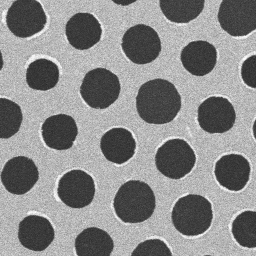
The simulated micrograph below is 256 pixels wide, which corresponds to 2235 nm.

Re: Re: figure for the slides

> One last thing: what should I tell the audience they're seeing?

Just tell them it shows a regular array of holes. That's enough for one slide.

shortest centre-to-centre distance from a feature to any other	517	nm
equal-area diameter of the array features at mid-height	334	nanometres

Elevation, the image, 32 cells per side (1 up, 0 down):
11000111111111101111000000110000
10000011111111111111000001100000
10000011100011111111100011100000
10000111000001110001111111110000
11001111000001100000111111111011
11111111100011100000111100111111
11111111111111100000111000011111
11110011111111110001111000011110
11100001111111111111111000011100
11100001111000011111111111111100
11100001110000011100001111111110
11111111110000011000001111111111
01111111110000011000000111001111
00011111111101111000000110000111
00011100011111111000001110000111
00011000001111111110111110000111
00111000001110001111111111001111
11111000011110000111100111111111
11111100011110000111000011111111
11111111111110000110000011110011
10001111111111111110000011100001
00000111000111111111000011100001
00000110000011111111111111100001
10001110000011100001111111110011
11111110000011000001111001111111
11111111000111000001110000111111
11111111111111000001100000011110
11100011111111100011110000111000
11000001111011111111110000111000
11000001110000111111111111111000
11100011100000111000011111111100
11111111100000111000011111111111